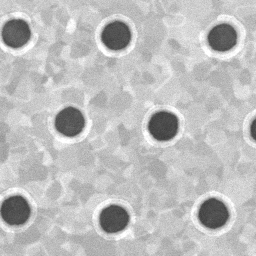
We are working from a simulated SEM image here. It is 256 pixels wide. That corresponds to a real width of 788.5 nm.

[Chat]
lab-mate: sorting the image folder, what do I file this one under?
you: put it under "holes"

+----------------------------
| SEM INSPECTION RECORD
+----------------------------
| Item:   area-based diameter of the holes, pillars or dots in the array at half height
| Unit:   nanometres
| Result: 101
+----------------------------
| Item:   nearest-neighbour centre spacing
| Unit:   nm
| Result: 304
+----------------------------